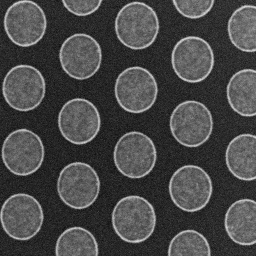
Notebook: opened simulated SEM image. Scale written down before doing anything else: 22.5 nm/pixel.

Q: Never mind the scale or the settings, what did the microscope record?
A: a regular array of raised bodies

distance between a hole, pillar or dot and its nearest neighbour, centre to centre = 1440 nm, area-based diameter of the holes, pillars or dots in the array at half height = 962 nanometres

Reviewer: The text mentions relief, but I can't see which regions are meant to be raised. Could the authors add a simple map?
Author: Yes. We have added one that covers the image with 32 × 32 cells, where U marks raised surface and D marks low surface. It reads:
DDUUDDDDUUUUDDDDUUDDDDUUUUDDDDDD
DUUUUDDDDUUDDDDUUUUDDDDUUUDDDDUU
DUUUUUDDDDDDDDDUUUUUDDDDDDDDDUUU
DUUUUUDDDDDDDDDUUUUUDDDDDDDDDUUU
DUUUUDDDDUUDDDDUUUUDDDDDDDDDDUUU
DDUUDDDDUUUUDDDDUUUDDDUUUUDDDUUU
DDDDDDDDUUUUUDDDDDDDDDUUUUDDDDDD
DDDDDDDDUUUUUDDDDDDDDDUUUUUDDDDD
DDUUDDDDUUUUDDDDDDDDDDUUUUDDDDDD
DUUUUDDDDUUDDDDUUUUDDDUUUUDDDUUU
DUUUUUDDDDDDDDDUUUUDDDDDDDDDDUUU
UUUUUDDDDDDDDDDUUUUDDDDDDDDDUUUU
DUUUUDDDDUDDDDDUUUUDDDDDDDDDDUUU
DDUUDDDDUUUUDDDDUUDDDDUUUUDDDUUU
DDDDDDDUUUUUDDDDDDDDDDUUUUDDDDDD
DDDDDDDUUUUUDDDDDDDDDUUUUUDDDDDD
DDUUDDDDUUUUDDDDDDDDDDUUUUDDDDDD
DUUUUDDDDUUDDDDUUUUDDDUUUUDDDUUU
UUUUUDDDDDDDDDDUUUUDDDDDDDDDDUUU
UUUUUDDDDDDDDDUUUUUDDDDDDDDDUUUU
DUUUUDDDDUDDDDDUUUUDDDDDDDDDUUUU
DDUUDDDDUUUUDDDUUUDDDDUUUDDDDUUU
DDDDDDDUUUUUDDDDDDDDDUUUUUDDDDDD
DDDDDDDUUUUUDDDDDDDDDUUUUUDDDDDD
DDUUDDDDUUUUDDDDDDDDDUUUUUDDDDDD
DUUUUDDDDUUDDDDUUUUDDDUUUUDDDUUU
UUUUUDDDDDDDDDUUUUUDDDDDDDDDUUUU
UUUUUDDDDDDDDDUUUUUDDDDDDDDDUUUU
DUUUUDDDDDDDDDUUUUUDDDDDDDDDUUUU
DUUUDDDDUUUDDDDUUUUDDDUUUDDDDUUU
DDDDDDDUUUUUDDDDDDDDDUUUUUDDDDDD
DDDDDDDUUUUUDDDDDDDDDUUUUUDDDDDD